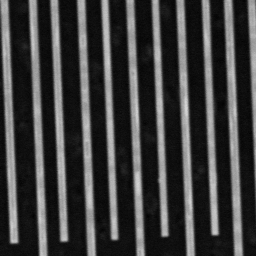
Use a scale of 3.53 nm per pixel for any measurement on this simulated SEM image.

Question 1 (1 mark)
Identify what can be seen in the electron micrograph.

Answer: parallel lines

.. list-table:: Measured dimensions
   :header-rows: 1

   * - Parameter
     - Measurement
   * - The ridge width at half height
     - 27.3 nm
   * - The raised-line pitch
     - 87.7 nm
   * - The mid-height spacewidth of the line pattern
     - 61.7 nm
